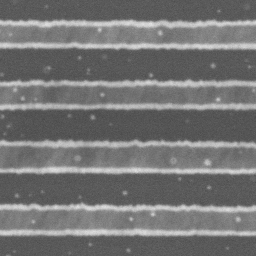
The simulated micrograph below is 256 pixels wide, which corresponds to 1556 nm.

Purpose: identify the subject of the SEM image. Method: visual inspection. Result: lines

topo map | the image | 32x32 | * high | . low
................................
................................
................................
********************************
********************************
********************************
................................
................................
................................
................................
********************************
********************************
********************************
................................
................................
................................
................................
................................
********************************
********************************
********************************
............................**..
................................
................................
................................
................................
********************************
********************************
********************************
................................
................................
................................